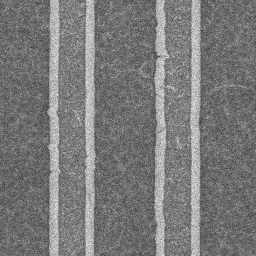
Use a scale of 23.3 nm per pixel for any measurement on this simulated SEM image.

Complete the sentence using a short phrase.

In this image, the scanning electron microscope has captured one or a few lines or trenches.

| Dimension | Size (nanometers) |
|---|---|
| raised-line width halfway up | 882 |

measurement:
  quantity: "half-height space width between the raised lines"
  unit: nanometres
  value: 1580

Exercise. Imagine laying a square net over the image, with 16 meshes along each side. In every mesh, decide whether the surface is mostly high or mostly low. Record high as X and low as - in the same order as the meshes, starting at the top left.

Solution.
---XXX----XX----
---XXX----XX----
---XXX----XX----
---XXX----XX----
---XXX----XX----
---XXX----XX----
---XXX----XX----
---XXX----XX----
---XXX----XX----
---XXX----XX----
---XXX----XX----
---XXX----XX----
---XXX----XX----
---XXX----XX----
---XXX----XX----
---XXX----XX----